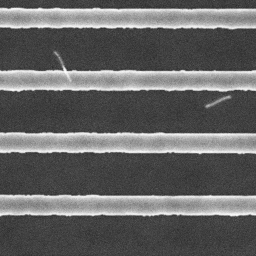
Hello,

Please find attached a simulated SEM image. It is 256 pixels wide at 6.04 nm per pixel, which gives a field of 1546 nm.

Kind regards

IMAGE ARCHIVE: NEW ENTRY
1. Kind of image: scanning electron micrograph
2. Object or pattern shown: lines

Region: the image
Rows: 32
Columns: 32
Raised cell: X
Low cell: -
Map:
--------------------------------
XXXXXXXXXXXXXXXXXXXXXXXXXXXXXXXX
XXXXXXXXXXXXXXXXXXXXXXXXXXXXXXXX
---------------------X----X-XX--
--------------------------------
--------------------------------
--------------------------------
--------------------------------
--------------------------------
XXXXXXXXXXXXXXXXXXXXXXXXXXXXXXXX
XXXXXXXXXXXXXXXXXXXXXXXXXXXXXXXX
--------------------------------
--------------------------------
--------------------------------
--------------------------------
--------------------------------
--------------------------------
XXXXXXXXXXXXXXXXXXXXXXXXXXXXXXXX
XXXXXXXXXXXXXXXXXXXXXXXXXXXXXXXX
--------------------------------
--------------------------------
--------------------------------
--------------------------------
--------------------------------
XXXXXXXXXXXXX-------------------
XXXXXXXXXXXXXXXXXXXXXXXXXXXXXXXX
XXXXXXXXXXXXXXXXXXXXXXXXXXXXXXXX
--------------------------------
--------------------------------
--------------------------------
--------------------------------
--------------------------------